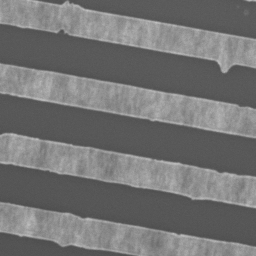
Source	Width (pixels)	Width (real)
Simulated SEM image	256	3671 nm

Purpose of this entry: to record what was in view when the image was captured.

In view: one or a few lines or trenches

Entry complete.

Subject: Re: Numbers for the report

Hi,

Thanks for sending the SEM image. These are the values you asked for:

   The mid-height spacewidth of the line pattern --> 0.567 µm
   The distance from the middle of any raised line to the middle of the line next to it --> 982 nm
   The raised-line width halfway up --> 411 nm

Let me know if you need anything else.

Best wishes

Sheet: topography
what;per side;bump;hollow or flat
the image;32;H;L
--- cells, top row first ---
HHHHHHLLHLLLLLLLLLLLLLLLLLLLLLLL
HHHHHHHHHHHHLLLLLLLLLLLLLLLLLLLL
HHHHHHHHHHHHHHHHHHLLLLLLLLLLLLLL
LLLLHHHHHHHHHHHHHHHHHHHLLLLLLLLL
LLLLLLLLLLHHHHHHHHHHHHHHHHHHHLLL
LLLLLLLLLLLLLLLLHHHHHHHHHHHHHHHH
LLLLLLLLLLLLLLLLLLLLLHHHHHHHHHHH
LLLLLLLLLLLLLLLLLLLLLLLLLLLHHHHH
HHHLLLLLLLLLLLLLLLLLLLLLLLLLHLLL
HHHHHHHHHLLLLLLLLLLLLLLLLLLLLLLL
HHHHHHHHHHHHHHHLLLLLLLLLLLLLLLLL
HHHHHHHHHHHHHHHHHHHHLLLLLLLLLLLL
LLLLLHHHHHHHHHHHHHHHHHHHHHLLLLLL
LLLLLLLLLLLHHHHHHHHHHHHHHHHHHHHL
LLLLLLLLLLLLLLLLLHHHHHHHHHHHHHHH
LLLLLLLLLLLLLLLLLLLLLLHHHHHHHHHH
LLLLLLLLLLLLLLLLLLLLLLLLLLLLHHHH
HHHHHLLLLLLLLLLLLLLLLLLLLLLLLLLL
HHHHHHHHHHHLLLLLLLLLLLLLLLLLLLLL
HHHHHHHHHHHHHHHHHLLLLLLLLLLLLLLL
LLHHHHHHHHHHHHHHHHHHHHLLLLLLLLLL
LLLLLLLHHHHHHHHHHHHHHHHHHHHLLLLL
LLLLLLLLLLLLHHHHHHHHHHHHHHHHHHHH
LLLLLLLLLLLLLLLLLLLHHHHHHHHHHHHH
LLLLLLLLLLLLLLLLLLLLLLLHHHHHHHHH
HLLLLLLLLLLLLLLLLLLLLLLLLLLLLLHH
HHHHHHHLLLLLLLLLLLLLLLLLLLLLLLLL
HHHHHHHHHHHHLLLLLLLLLLLLLLLLLLLL
HHHHHHHHHHHHHHHHHHLLLLLLLLLLLLLL
LLLLHHHHHHHHHHHHHHHHHHLLLLLLLLLL
LLLLLLLHHHHHHHHHHHHHHHHHHHHHHHLL
LLLLLLLLLLLLLLLHHHHHHHHHHHHHHHHH